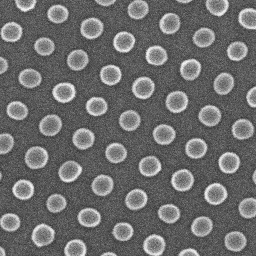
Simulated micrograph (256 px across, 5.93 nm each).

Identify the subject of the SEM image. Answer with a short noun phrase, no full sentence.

a regular array of raised bodies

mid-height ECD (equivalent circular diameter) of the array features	119	nanometers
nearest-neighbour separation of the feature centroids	206	nm